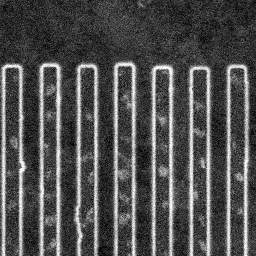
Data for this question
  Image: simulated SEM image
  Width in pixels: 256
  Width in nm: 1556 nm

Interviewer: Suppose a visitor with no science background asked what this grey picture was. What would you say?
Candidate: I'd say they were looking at parallel lines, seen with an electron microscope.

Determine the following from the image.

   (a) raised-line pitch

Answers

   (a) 37.5 pixels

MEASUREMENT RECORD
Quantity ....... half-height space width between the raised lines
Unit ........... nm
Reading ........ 103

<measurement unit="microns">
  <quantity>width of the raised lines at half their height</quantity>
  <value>0.125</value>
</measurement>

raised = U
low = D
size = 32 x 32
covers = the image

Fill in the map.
UUUUUUUUUUUUUUUUUUUUUUUUUUUUUUUU
UUUUUUUUUUUUUUUUUUUUUUUUUUUUUUUU
UUUUUUUUUUUUUUUUUUUUUUUUUUUUUUUU
UUUUUUUUUUUUUUUUUUUUUUUUUUUUUUUU
UUUUUUUUUUUUUUUUUUUUUUUUUUUUUUUU
UUUUUUUUUUUUUUUUUUUUUUUUUUUUUUUU
UUUUUUUUUUUUUUUUUUUUUUUUUUUUUUUU
UUUUUUUUUUUUUUUUUUUUUUUUUUUUUUUU
UDUUUDDUUUDDUUUDDUUUDUUUUUUUUDUU
DDDUUDDUUUDDUUDDDUUDDUUUDDUUUDDU
DDDUUDDUUUDDUUDDDUUDDUUUDDUUUDDU
DDDUUDDUUUDDUUDDDUUDDUUUDDUUUDDU
DDDUUDDUUUDDUUDDDUUDDUUUDDUUUDDU
DDDUUDDUUUDDUUDDDUUDDUUUDDUUUDDU
DDDUUDDUUUDDUUDDDUUDDUUUDDUUUDDU
DDDUUDDUUUDDUUDDDUUDDUUUDDUUUDDU
DDDUUDDUUUDDUUDDDUUDDUUUDDUUUDDU
DDDUUDDUUUDDUUDDDUUDDUUUDDUUUDDU
DDDUUDDUUUDDUUDDDUUDDUUUDDUUUDDU
DDDUUDDUUUDDUUDDDUUDDUUUDDUUUDDU
DDDUUDDUUUDDUUDDDUUDDUUUDDUUUDDU
DDDUUDDUUUDDUUDDDUUDDUUUDDUUUDDU
DDDUUDDUUUDDUUDDDUUDDUUUDDUUUDDU
DDDUUDDUUUDDUUDDDUUDDUUUDDUUUDDU
DDDUUDDUUUDDUUDDDUUDDUUUDDUUUDDU
DDDUUDDUUUDDUUDDDUUDDUUUDDUUUDDU
DDDUUDDUUUDDUUDDDUUDDUUUDDUUUDDU
DDDUUDDUUUDDUUDDDUUDDUUUDDUUUDDU
DDDUUDDUUUDDUUDDDUUDDUUUDDUUUDDU
DDDUUDDUUUDDUUDDDUUDDUUUDDUUUDDU
DDDUUDDUUUDDUUDDDUUDDUUUDDUUUDDU
DDDUUDDUUUDDUUDDDUUDDUUUDDUUUDDU